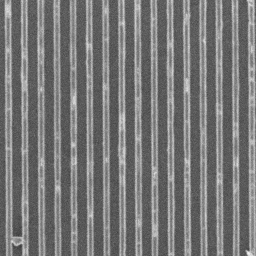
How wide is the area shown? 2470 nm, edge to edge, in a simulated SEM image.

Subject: parallel lines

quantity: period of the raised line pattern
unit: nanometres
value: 156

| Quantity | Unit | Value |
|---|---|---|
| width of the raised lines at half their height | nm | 51.9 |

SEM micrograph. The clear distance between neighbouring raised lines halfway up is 0.103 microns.